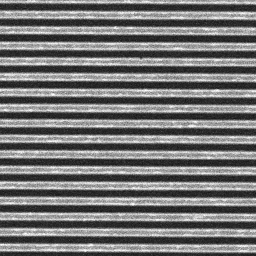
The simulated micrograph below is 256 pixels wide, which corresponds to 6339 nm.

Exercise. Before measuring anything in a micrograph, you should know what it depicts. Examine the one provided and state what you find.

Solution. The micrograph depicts parallel lines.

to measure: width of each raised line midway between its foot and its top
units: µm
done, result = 0.173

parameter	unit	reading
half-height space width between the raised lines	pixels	8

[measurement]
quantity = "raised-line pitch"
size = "15.5 px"